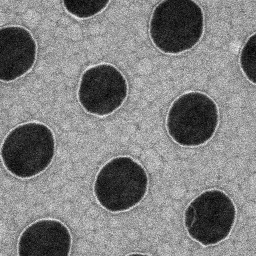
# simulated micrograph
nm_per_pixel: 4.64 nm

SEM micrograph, raised bodies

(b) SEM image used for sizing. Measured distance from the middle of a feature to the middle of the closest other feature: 95.3 pixels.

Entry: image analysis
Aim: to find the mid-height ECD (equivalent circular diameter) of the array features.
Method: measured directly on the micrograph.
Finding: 254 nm